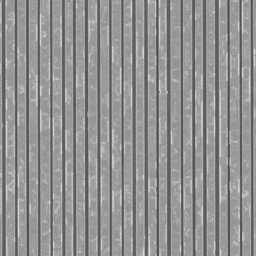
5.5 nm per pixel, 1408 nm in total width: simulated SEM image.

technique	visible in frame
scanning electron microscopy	parallel lines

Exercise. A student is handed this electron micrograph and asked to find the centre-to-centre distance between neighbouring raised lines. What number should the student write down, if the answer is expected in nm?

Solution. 64.8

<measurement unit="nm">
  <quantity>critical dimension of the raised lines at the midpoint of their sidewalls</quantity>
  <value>44.7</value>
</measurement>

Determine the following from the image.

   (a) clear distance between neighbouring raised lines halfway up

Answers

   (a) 3.49 pixels